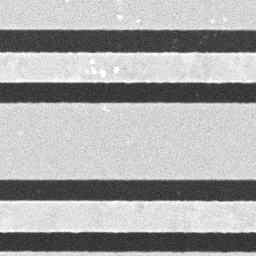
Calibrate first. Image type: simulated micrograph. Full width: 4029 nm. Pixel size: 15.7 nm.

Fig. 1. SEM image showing lines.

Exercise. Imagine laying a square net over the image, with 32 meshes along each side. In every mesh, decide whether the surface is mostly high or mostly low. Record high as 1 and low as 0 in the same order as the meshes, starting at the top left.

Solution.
11111111111111111111111111111111
11111111111111111111111111111111
11111111111111111111111111111111
11111111111111111111111111111111
00000000000000000000000000000000
00000000000000000000000000000000
00000000000000000000000000000000
11111111111111111111111111111111
11111111111111111111111111111111
11111111111111111111111111111111
00000000000000000000000000000000
00000000000000000000000000000000
00000000000000000000000000000000
11111111111111111111111111111111
11111111111111111111111111111111
11111111111111111111111111111111
11111111111111111111111111111111
11111111111111111111111111111111
11111111111111111111111111111111
11111111111111111111111111111111
11111111111111111111111111111111
11111111111111111111111111111111
00000000000000000000000000000000
00000000000000000000000000000000
00000000000000000000000000000000
11111111111111111111111111111111
11111111111111111111111111111111
11111111111111111111111111111111
11111111111111111111111111111111
00000000000000000000000000000000
00000000000000000000000000000000
00000000000000000000000000000000